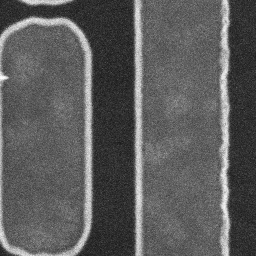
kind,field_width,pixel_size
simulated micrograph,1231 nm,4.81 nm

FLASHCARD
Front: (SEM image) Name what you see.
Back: one or a few lines or trenches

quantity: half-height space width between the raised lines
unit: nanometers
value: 409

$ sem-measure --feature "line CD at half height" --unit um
0.245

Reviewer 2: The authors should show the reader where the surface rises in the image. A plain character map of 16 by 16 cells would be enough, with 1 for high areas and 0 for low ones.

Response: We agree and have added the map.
1111111110000011
1000111110000011
0000011110000011
0000011110000011
0000001110000011
0000011110000011
0000001110000011
0000001110000011
0000001110000011
0000001110000011
0000001110000011
0000001110000011
0000011110000011
0000011110000011
0000011110000011
1000011110000011